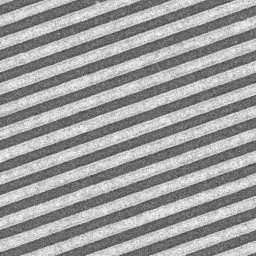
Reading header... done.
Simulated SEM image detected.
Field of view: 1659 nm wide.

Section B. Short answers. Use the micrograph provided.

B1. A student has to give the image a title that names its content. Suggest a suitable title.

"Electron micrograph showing parallel lines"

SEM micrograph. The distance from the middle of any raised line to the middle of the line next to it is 137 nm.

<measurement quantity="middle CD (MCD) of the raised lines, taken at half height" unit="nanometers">68.8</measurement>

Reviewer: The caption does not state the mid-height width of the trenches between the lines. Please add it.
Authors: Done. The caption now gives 68.8 nm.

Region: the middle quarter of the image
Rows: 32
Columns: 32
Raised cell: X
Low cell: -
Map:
XXXXX--------XXXXXXXX--------XXX
X---------XXXXXXXX--------XXXXXX
-------XXXXXXX---------XXXXXXXX-
----XXXXXXX---------XXXXXXXX----
-XXXXXXXX--------XXXXXXXX-------
XXXXXX--------XXXXXXXX--------XX
XXXX--------XXXXXXXX--------XXXX
X--------XXXXXXXX--------XXXXXXX
------XXXXXXXX--------XXXXXXXX--
---XXXXXXXX--------XXXXXXXX-----
XXXXXXXX--------XXXXXXXX--------
XXXXX--------XXXXXXXX--------XXX
XX--------XXXXXXXX--------XXXXXX
--------XXXXXXXX--------XXXXXXX-
-----XXXXXXXX--------XXXXXXX----
--XXXXXXXX--------XXXXXXX-------
XXXXXXX--------XXXXXXX---------X
XXXX--------XXXXXXX---------XXXX
X--------XXXXXXXX--------XXXXXXX
-------XXXXXXX--------XXXXXXXX--
----XXXXXXX---------XXXXXXXX----
-XXXXXXX---------XXXXXXX--------
XXXXX---------XXXXXXXX--------XX
XX---------XXXXXXX---------XXXXX
--------XXXXXXX---------XXXXXXXX
-----XXXXXXXX--------XXXXXXXX---
---XXXXXXX---------XXXXXXX------
XXXXXXXX--------XXXXXXXX--------
XXXXX--------XXXXXXXX--------XXX
X---------XXXXXXXX--------XXXXXX
-------XXXXXXXX--------XXXXXXXX-
----XXXXXXXX--------XXXXXXXX----